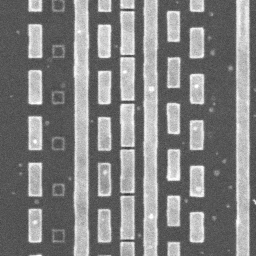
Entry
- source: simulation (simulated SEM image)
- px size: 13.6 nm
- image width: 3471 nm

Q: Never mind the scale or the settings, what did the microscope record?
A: wiring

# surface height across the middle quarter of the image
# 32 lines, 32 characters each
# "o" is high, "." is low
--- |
...ooo........ooo...ooo...ooo...
...ooo........ooo...ooo...ooo...
...ooo...ooo..ooo...ooo...ooo...
...ooo...ooo..ooo...ooo...ooo...
...ooo...ooo..ooo...ooo...ooo...
...ooo...ooo..ooo...ooo...ooo...
...ooo...oo...ooo...ooo.........
...ooo...oo....oo...ooo.........
...ooo...oo....oo...ooo.........
...ooo...oo.........ooo.........
...ooo........ooo...ooo...ooo...
...ooo........ooo...ooo...ooo...
...ooo........ooo...ooo...ooo...
...ooo........ooo...ooo...ooo...
...ooo...oo...ooo...ooo...ooo...
...ooo...oo....oo...ooo...ooo...
...ooo...oo....oo...ooo...ooo...
...ooo...ooo...oo...ooo.........
...ooo...ooo...oo...ooo.........
...ooo...ooo...oo...ooo.........
...ooo...ooo...oo...ooo.........
...ooo...oo.........ooo.........
...ooo........ooo...ooo...ooo...
...ooo........ooo...ooo...ooo...
...ooo.........oo...ooo...ooo...
...ooo...oo....oo...ooo...ooo...
...ooo...oo....oo...ooo...ooo...
...ooo...oo....oo...ooo...ooo...
...ooo...ooo..ooo...ooo...ooo...
...ooo...ooo..ooo...ooo.........
...ooo...ooo..ooo...ooo.........
...ooo...ooo..ooo...ooo.........